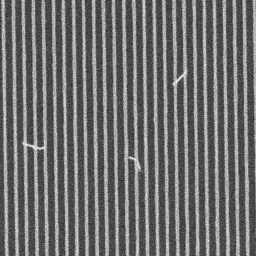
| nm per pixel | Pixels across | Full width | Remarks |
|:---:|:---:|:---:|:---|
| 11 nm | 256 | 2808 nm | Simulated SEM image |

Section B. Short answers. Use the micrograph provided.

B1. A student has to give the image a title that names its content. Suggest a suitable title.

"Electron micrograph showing parallel lines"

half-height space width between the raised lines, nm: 83.7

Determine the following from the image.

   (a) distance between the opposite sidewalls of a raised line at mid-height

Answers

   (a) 28.8 nm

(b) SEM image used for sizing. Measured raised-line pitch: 0.11 µm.